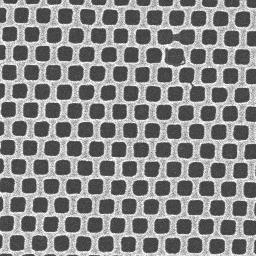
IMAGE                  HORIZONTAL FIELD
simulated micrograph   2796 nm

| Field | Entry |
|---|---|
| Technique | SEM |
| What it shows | a regular array of holes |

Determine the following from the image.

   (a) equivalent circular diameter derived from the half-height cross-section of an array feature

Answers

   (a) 183 nanometres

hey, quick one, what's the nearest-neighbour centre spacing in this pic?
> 236 nanometers